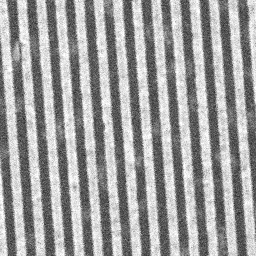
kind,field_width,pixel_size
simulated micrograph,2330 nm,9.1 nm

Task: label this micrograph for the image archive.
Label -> parallel lines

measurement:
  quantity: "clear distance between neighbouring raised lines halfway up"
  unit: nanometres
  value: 107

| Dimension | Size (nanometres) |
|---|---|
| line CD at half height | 69.2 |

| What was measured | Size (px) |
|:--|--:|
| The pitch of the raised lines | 19.1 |